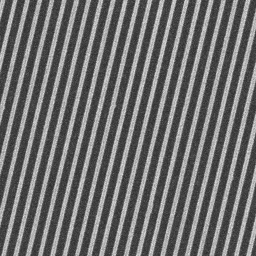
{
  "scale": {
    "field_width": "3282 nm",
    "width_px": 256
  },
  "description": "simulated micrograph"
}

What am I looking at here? parallel lines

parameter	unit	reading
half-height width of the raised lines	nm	43.7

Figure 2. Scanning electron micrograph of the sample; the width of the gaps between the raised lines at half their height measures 109 nanometres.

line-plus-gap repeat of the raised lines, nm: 153